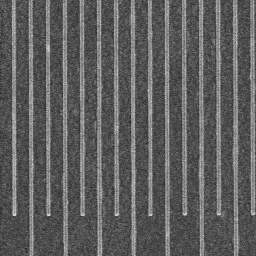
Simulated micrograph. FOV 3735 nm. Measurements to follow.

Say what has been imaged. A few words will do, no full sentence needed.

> parallel lines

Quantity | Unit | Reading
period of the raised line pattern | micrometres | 0.249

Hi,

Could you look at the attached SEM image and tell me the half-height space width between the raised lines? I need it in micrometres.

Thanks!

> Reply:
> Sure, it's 0.199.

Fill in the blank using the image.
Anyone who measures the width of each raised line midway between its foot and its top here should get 0.0511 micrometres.